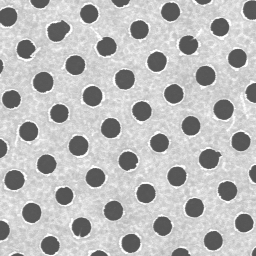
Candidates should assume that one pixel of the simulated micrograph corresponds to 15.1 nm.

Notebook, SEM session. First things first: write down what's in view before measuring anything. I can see a regular array of holes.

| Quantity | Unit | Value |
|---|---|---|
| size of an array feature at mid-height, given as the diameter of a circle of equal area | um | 0.296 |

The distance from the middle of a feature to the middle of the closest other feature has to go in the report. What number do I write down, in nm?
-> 542